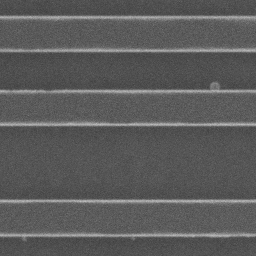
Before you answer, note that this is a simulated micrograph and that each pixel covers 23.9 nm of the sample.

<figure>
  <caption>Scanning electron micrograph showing lines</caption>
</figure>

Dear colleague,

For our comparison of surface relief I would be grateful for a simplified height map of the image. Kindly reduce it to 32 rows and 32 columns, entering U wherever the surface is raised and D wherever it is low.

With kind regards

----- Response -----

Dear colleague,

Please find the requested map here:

DDDDDDDDDDDDDDDDDDDDDDDDDDDDDDDD
DDDDDDDDDDDDDDDDDDDDDDDDDDDDDDDD
UUUUUUUUUUUUUUUUUUUUUUUUUUUUUUUU
UUUUUUUUUUUUUUUUUUUUUUUUUUUUUUUU
UUUUUUUUUUUUUUUUUUUUUUUUUUUUUUUU
UUUUUUUUUUUUUUUUUUUUUUUUUUUUUUUU
DDDDDDDDDDDDDDDDDDDDDDDDDDDDDDDD
DDDDDDDDDDDDDDDDDDDDDDDDDDDDDDDD
DDDDDDDDDDDDDDDDDDDDDDDDDDDDDDDD
DDDDDDDDDDDDDDDDDDDDDDDDDDDDDDDD
DDDDDDDDDDDDDDDDDDDDDDDDDDDDDDDD
UUUUUUUUUUUUUUUUUUUUUUUUUUUUUUUU
UUUUUUUUUUUUUUUUUUUUUUUUUUUUUUUU
UUUUUUUUUUUUUUUUUUUUUUUUUUUUUUUU
UUUUUUUUUUUUUUUUUUUUUUUUUUUUUUUU
UUUUUUUUUUUUUUUUUUUUUUUUUUUUUUUU
DDDDDDDDDDDDDDDDDDDDDDDDDDDDDDDD
DDDDDDDDDDDDDDDDDDDDDDDDDDDDDDDD
DDDDDDDDDDDDDDDDDDDDDDDDDDDDDDDD
DDDDDDDDDDDDDDDDDDDDDDDDDDDDDDDD
DDDDDDDDDDDDDDDDDDDDDDDDDDDDDDDD
DDDDDDDDDDDDDDDDDDDDDDDDDDDDDDDD
DDDDDDDDDDDDDDDDDDDDDDDDDDDDDDDD
DDDDDDDDDDDDDDDDDDDDDDDDDDDDDDDD
DDDDDDDDDDDDDDDDDDDDDDDDDDDDDDDD
UUUUUUUUUUUUUUUUUUUUUUUUUUUUUUUU
UUUUUUUUUUUUUUUUUUUUUUUUUUUUUUUU
UUUUUUUUUUUUUUUUUUUUUUUUUUUUUUUU
UUUUUUUUUUUUUUUUUUUUUUUUUUUUUUUU
DDDDDDDDDDDDDDDDDDDDDDDDDDDDDDDD
DDDDDDDDDDDDDDDDDDDDDDDDDDDDDDDD
DDDDDDDDDDDDDDDDDDDDDDDDDDDDDDDD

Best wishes